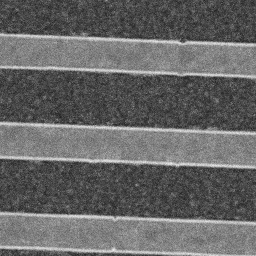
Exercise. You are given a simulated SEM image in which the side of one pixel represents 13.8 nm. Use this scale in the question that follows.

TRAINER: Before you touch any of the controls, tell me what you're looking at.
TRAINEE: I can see one or a few lines or trenches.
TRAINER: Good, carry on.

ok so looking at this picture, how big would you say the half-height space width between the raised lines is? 0.78 micrometres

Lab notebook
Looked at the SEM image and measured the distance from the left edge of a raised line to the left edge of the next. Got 89.6 pixels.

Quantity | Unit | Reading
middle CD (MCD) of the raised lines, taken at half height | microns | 0.46